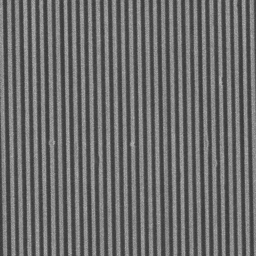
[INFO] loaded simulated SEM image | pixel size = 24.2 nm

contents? parallel lines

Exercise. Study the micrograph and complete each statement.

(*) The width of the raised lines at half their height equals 0.0906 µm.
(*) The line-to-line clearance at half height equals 0.115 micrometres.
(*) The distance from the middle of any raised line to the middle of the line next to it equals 196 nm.